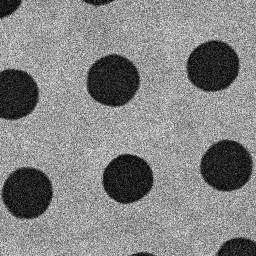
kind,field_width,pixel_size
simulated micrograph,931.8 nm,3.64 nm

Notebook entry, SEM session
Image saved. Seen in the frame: holes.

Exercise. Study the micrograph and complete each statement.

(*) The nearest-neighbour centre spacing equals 363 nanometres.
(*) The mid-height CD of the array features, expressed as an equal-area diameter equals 186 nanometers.